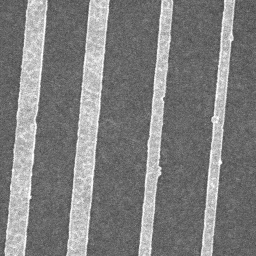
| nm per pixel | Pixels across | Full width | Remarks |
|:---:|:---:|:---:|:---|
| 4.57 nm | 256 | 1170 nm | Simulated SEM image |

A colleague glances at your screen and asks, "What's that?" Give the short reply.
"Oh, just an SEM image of one or a few lines or trenches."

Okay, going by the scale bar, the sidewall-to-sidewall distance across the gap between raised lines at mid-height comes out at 0.236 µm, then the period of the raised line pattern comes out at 292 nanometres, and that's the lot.